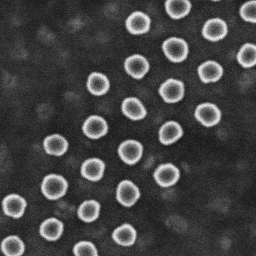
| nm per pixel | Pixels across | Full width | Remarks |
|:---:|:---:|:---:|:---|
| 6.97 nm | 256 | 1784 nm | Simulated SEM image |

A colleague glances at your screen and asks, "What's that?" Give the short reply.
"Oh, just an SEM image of a regular array of raised bodies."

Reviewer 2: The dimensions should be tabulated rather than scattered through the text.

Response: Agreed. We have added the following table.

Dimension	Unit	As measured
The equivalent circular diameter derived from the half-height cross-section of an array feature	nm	147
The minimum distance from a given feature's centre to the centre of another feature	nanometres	292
